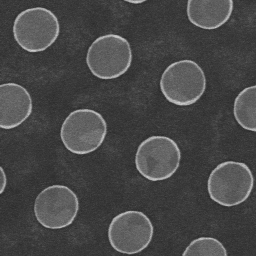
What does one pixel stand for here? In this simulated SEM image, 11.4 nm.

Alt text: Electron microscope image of a regular array of raised bodies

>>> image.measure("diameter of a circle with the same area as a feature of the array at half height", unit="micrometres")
0.492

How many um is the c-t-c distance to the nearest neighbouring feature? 0.889